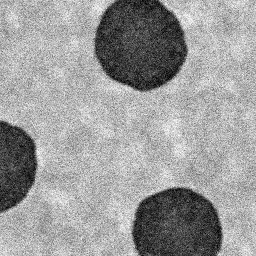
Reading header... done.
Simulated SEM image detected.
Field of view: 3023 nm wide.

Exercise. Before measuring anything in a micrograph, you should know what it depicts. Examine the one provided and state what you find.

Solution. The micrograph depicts holes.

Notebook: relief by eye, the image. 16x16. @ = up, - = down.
@@@@@@@---@@@@@@
@@@@@@-----@@@@@
@@@@@@------@@@@
@@@@@@------@@@@
@@@@@@@----@@@@@
@@@@@@@@--@@@@@@
@@@@@@@@@@@@@@@@
@@@@@@@@@@@@@@@@
--@@@@@@@@@@@@@@
--@@@@@@@@@@@@@@
--@@@@@@@@@@@@@@
--@@@@@@@@@@@@@@
-@@@@@@@@----@@@
@@@@@@@@------@@
@@@@@@@@------@@
@@@@@@@@------@@